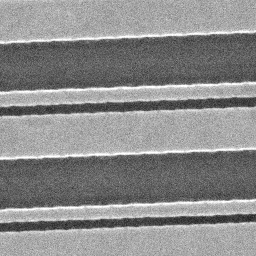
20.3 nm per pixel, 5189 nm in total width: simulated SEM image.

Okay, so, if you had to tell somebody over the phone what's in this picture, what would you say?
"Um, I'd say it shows lines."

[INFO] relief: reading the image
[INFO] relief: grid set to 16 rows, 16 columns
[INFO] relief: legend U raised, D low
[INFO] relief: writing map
UUUUUUUUUUUUUUUU
UUUUUUUUUUUUUUUU
UUUDDDDDDDDDDDDD
DDDDDDDDDDDDDDDD
DDDDDDDDDDDDDDDD
DDDDDDDDUUUUUUUU
UUUUUUUUUUUUUUUU
UUUUUUUUUUUUUUUU
UUUUUUUUUUUUUUUU
UUUUUUUUUUDDDDDD
DDDDDDDDDDDDDDDD
DDDDDDDDDDDDDDDD
DDDDDDDDDDDDDDDD
UUUUUUUUUUUUUUUU
UUUUUUUUUUUUUUUU
UUUUUUUUUUUUUUUU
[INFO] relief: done